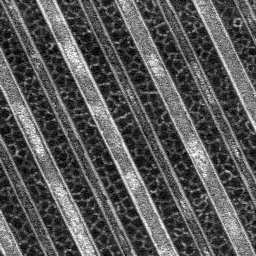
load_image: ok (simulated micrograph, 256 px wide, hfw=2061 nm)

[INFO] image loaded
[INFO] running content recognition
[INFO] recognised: parallel lines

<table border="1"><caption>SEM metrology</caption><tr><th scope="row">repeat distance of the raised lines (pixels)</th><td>35.1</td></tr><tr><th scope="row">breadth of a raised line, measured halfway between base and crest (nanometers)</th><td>180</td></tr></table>